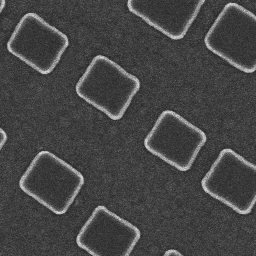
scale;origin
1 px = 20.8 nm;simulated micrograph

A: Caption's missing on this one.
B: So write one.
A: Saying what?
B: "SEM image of raised bodies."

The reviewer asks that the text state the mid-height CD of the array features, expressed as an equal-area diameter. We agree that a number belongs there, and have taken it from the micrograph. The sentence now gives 1.1 micrometres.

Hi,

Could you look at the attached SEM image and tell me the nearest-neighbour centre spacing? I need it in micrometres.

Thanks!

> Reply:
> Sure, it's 1.76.